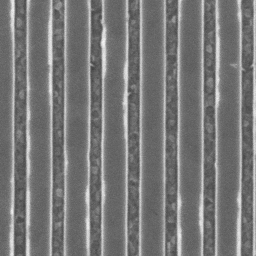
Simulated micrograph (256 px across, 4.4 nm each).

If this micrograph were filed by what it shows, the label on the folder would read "parallel lines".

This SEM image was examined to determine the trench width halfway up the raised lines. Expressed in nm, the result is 59.4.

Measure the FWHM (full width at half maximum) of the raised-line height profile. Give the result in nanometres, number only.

107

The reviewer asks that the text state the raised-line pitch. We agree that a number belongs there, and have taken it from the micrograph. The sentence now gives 166 nm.